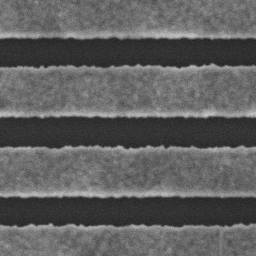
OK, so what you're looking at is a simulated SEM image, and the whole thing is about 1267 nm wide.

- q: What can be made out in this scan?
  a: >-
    lines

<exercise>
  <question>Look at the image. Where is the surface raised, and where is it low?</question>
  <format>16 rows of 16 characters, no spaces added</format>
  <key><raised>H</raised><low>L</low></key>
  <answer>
HHHHHHHHHHHHHHHH
HHHHHHHHHHHHHHHH
LLLLLLLLLLLLLLLL
LLLLLLLLLLLLLLLL
HHHHHHHHHHHHHHHH
HHHHHHHHHHHHHHHH
HHHHHHHHHHHHHHHH
LLLLLLLLLLLLLLLL
LLLLLLLLLLLLLLLL
HHHHHHHHHHHHHHHH
HHHHHHHHHHHHHHHH
HHHHHHHHHHHHHHHH
LLLLLLLLLLLLLLLL
LLLLLLLLLLLLLLLL
HHHHHHHHHHHHHHHH
HHHHHHHHHHHHHHHH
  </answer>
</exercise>